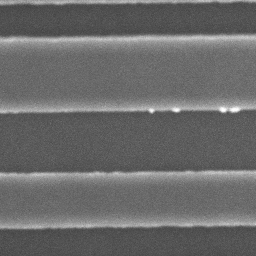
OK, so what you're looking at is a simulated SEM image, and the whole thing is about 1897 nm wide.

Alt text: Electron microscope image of lines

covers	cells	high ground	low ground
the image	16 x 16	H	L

LLLLLLLLLLLLLLLL
LLLLLLLLLLLLLLLL
HLLHHHHHHHHHHHHH
HHHHHHHHHHHHHHHH
HHHHHHHHHHHHHHHH
HHHHHHHHHHHHHHHH
HHHHHHHHHHHHHHHH
LLLLLLLLLLLLLLLL
LLLLLLLLLLLLLLLL
LLLLLLLLLLLLLLLL
LLLLLLLLLLLLLLLL
HHHHHHHHHHHHHHHH
HHHHHHHHHHHHHHHH
HHHHHHHHHHHHHHHH
LLLLLLLLLLLLLLLL
LLLLLLLLLLLLLLLL